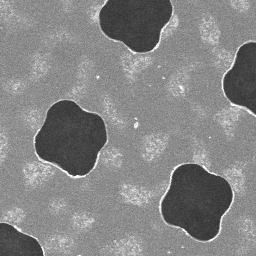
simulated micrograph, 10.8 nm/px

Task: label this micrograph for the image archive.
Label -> holes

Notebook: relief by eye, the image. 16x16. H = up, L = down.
HHHHHHLLLLLHHHHH
HHHHHHLLLLHHHHHH
HHHHHHHLLLHHHHHH
HHHHHHHHHHHHHHHL
HHHHHHHHHHHHHHLL
HHHHHHHHHHHHHHLL
HHHLLHHHHHHHHHHL
HHHLLLHHHHHHHHHH
HHLLLLLHHHHHHHHH
HHLLLLHHHHHHHHHH
HHHHLLHHHHHLLHHH
HHHHHHHHHHHLLLHH
HHHHHHHHHHLLLLHH
HHHHHHHHHHLLLLHH
LHHHHHHHHHHHLLHH
LLLHHHHHHHHHHHHH